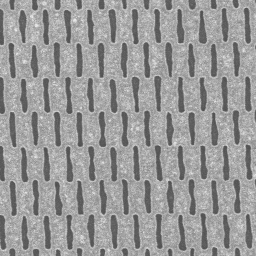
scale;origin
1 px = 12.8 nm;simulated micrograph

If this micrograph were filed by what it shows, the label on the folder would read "a regular array of holes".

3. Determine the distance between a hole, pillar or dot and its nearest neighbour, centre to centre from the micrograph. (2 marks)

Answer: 0.285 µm